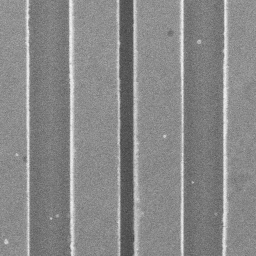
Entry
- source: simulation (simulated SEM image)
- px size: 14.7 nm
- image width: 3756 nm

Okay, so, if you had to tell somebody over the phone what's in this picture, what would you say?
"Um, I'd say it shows lines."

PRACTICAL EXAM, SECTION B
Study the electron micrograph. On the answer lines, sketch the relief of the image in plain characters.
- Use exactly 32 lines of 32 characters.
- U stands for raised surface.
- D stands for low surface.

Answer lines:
UUUDDDDDDUUUUUUDDUUUUUUDDDDDUUUU
UUUDDDDDDUUUUUUDDUUUUUUDDDDDUUUU
UUUDDDDDDUUUUUUDDUUUUUUDDDDDUUUU
UUUDDDDDDUUUUUUDDUUUUUUDDDDDUUUU
UUUDDDDDDUUUUUUDDUUUUUUDDDDDUUUU
UUUDDDDDDUUUUUUDDUUUUUUDDDDDUUUU
UUUUDDDDDUUUUUUDDUUUUUUDDDDDUUUU
UUUDDDDDDUUUUUUDDUUUUUUDDDDDUUUU
UUUUDDDDDUUUUUUDDUUUUUUDDDDDUUUU
UUUUDDDDDUUUUUUDDUUUUUUDDDDDUUUU
UUUDDDDDDUUUUUUDDUUUUUUDDDDDUUUU
UUUUDDDDDUUUUUUDDUUUUUUDDDDDUUUU
UUUDDDDDDUUUUUUDDUUUUUUDDDDDUUUU
UUUUDDDDDUUUUUUDDUUUUUUDDDDDUUUU
UUUUDDDDDUUUUUUDDUUUUUUDDDDDUUUU
UUUUDDDDDUUUUUUDDUUUUUUDDDDDUUUU
UUUUDDDDDUUUUUUDDUUUUUUDDDDDUUUU
UUUUDDDDDUUUUUUDDUUUUUUDDDDDUUUU
UUUUDDDDDUUUUUUDDUUUUUUDDDDDUUUU
UUUUDDDDDUUUUUUDDUUUUUUDDDDDUUUU
UUUUDDDDDUUUUUUDDUUUUUUDDDDDUUUU
UUUUDDDDDUUUUUUDDUUUUUUDDDDDUUUU
UUUUDDDDDUUUUUUDDUUUUUUDDDDDUUUU
UUUUDDDDDUUUUUUDDUUUUUUDDDDDUUUU
UUUUDDDDDUUUUUUDDUUUUUUDDDDDUUUU
UUUUDDDDDUUUUUUDDUUUUUUDDDDDUUUU
UUUUDDDDDUUUUUUDDUUUUUUDDDDDUUUU
UUUUDDDDDUUUUUUDDUUUUUUDDDDDUUUU
UUUUDDDDDUUUUUUDDUUUUUUDDDDDUUUU
UUUUDDDDDUUUUUUDDUUUUUUDDDDDUUUU
UUUUDDDDDUUUUUUDDUUUUUUDDDDDUUUU
UUUUDDDDDUUUUUUDDUUUUUUDDDDDUUUU